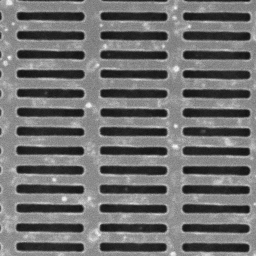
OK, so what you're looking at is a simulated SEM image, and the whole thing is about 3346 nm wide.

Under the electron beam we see a regular array of holes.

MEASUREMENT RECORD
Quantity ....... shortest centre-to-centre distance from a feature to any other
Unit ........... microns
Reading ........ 0.252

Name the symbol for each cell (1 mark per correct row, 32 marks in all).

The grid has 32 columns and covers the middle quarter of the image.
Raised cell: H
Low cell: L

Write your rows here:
HHHHHHHHHHHHHHHHHHHHHHHHHHHHHHHH
LLLLHHHHHHLLLLLLLLLLLLLLLHHHHHLL
LLLLLHHHHLLLLLLLLLLLLLLLLLHHHLLL
LLLLLHHHHHLLLLLLLLLLLLLLLLHHHHLL
HHHHHHHHHHHHHHHHHHHHHHHHHHHHHHHH
HHHHHHHHHHHHHHHHHHHHHHHHHHHHHHHH
LLLLLHHHHLLLLLLLLLLLLLLLLHHHHHLL
LLLLLHHHHLLLLLLLLLLLLLLLLLHHHLLL
LLLLHHHHHHLLLLLLLLLLLLLLLHHHHHLL
HHHHHHHHHHHHHHHHHHHHHHHHHHHHHHHH
HHHHHHHHHHHHHHHHHHHHHHHHHHHHHHHH
LLLLLHHHHLLLLLLLLLLLLLLLLLHHHHLL
LLLLLHHHHLLLLLLLLLLLLLLLLLHHHLLL
HHHHHHHHHHHHHHHHHHHHHHHHHHHHHHLL
HHHHHHHHHHHHHHHHHHHHHHHHHHHHHHHH
HHHHHHHHHHHHHHHHHHHHHHHHHHHHHHHH
LLLLLHHHHLLLLLLLLLLLLLLLLLHHHHLL
LLLLLHHHHLLLLLLLLLLLLLLLLLHHHHLL
HHHHHHHHHHHHHHHHHHHHHHHHHHHHHHHH
HHHHHHHHHHHHHHHHHHHHHHHHHHHHHHHH
HHHHHHHHHHLHHHHHHHHHHHHHHHHHHHHL
LLLLLHHHHLLLLLLLLLLLLLLLLLHHHLLL
LLLLLHHHHLLLLLLLLLLLLLLLLLHHHHLL
HHHHHHHHHHHHHHHHHHHHHHHHHHHHHHHH
HHHHHHHHHHHHHHHHHHHHHHHHHHHHHHHH
LLLLHHHHHHLLLLLLLLLLLLLLLHHHHHLL
LLLLLHHHHLLLLLLLLLLLLLLLLLHHHLLL
LLLLLHHHHHLLLLLLLLLLLLLLLLHHHHLL
HHHHHHHHHHHHHHHHHHHHHHHHHHHHHHHH
HHHHHHHHHHHHHHHHHHHHHHHHHHHHHHHH
LLLLLHHHHLLLLLLLLLLLLLLLLHHHHHLL
LLLLLHHHHLLLLLLLLLLLLLLLLLHHHLLL